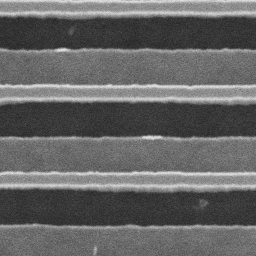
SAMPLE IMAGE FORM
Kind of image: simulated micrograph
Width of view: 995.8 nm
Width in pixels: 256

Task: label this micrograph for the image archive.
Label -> lines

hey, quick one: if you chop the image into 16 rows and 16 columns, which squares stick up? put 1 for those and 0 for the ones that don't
1111111111111111
0000000000000000
0000000000000000
1111111111111111
1111111111111111
1111111111111111
0000000000000000
0000000000000000
0000000000000000
1111111111111111
1111111111111111
1111111111111111
0000000000000000
0000000000000000
1111111111111111
1111111111111111